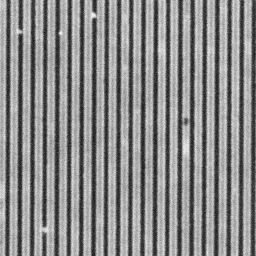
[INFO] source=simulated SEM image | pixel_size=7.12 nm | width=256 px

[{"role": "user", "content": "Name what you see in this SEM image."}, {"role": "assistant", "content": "parallel lines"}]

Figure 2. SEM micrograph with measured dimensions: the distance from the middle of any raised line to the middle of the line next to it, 87.5 nm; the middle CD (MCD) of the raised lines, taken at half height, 48.1 nm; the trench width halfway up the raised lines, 41 nanometers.